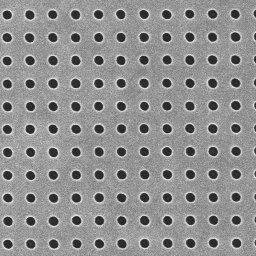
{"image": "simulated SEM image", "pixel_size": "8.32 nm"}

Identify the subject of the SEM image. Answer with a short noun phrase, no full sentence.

a regular array of holes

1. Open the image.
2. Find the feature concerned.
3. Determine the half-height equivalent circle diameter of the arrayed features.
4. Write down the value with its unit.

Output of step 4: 77.4 nanometers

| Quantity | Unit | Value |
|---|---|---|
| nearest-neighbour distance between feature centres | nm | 187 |